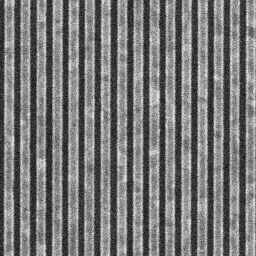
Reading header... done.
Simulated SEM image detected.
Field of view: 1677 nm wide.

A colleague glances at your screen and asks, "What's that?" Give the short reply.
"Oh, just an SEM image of parallel lines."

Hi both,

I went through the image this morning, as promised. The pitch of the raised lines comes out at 106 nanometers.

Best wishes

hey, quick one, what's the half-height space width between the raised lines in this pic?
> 0.0549 microns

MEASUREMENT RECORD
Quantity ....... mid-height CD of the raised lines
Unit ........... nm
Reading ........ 49.9